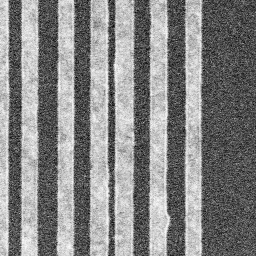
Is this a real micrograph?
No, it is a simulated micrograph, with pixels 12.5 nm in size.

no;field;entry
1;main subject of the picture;parallel lines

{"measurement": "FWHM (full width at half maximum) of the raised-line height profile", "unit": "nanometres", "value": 182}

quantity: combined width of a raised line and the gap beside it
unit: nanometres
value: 410